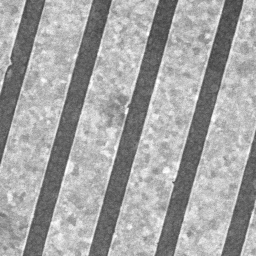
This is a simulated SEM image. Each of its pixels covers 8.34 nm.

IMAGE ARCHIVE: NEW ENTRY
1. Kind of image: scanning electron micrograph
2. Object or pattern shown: one or a few lines or trenches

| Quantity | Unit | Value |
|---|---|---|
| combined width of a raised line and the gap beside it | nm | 532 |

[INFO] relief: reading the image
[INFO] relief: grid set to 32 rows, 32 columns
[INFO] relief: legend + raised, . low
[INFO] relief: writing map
+++...+++++...++++++..++++++..++
+++..++++++...+++++...++++++..++
++...++++++..++++++...+++++...++
++...++++++..++++++..++++++...++
++...+++++...+++++...++++++..+++
++..++++++...+++++...++++++..+++
+...++++++..++++++...+++++...+++
+...+++++...++++++..++++++...+++
+..++++++...+++++...++++++..++++
+..++++++...+++++...+++++...++++
...++++++..++++++..++++++...++++
...+++++...++++++..++++++..+++++
..++++++...+++++...++++++..+++++
..++++++..++++++...+++++...+++++
..++++++..++++++..++++++...+++++
..+++++...+++++...++++++..++++++
.++++++...+++++...+++++...++++++
.++++++..++++++...+++++...++++++
.+++++...++++++..++++++...+++++.
++++++...+++++...++++++..++++++.
++++++..++++++...+++++...++++++.
++++++..++++++..++++++...+++++..
+++++...++++++..++++++..++++++..
+++++...+++++...++++++..++++++..
+++++..++++++...+++++...++++++..
++++...++++++..++++++...+++++...
++++...+++++...++++++..++++++...
++++...+++++...+++++...++++++..+
++++..++++++..++++++...+++++...+
+++...++++++..++++++..++++++...+
+++...+++++...++++++..++++++...+
+++..++++++...+++++...++++++..++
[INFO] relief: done